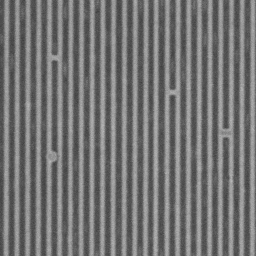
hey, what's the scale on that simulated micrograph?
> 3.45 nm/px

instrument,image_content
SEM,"parallel lines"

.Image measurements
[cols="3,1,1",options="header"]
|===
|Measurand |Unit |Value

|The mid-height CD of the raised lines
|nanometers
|9.5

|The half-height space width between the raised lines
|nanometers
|27.1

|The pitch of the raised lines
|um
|0.0369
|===